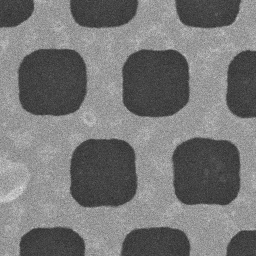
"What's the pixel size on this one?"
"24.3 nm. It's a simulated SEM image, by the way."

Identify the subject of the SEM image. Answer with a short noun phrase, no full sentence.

holes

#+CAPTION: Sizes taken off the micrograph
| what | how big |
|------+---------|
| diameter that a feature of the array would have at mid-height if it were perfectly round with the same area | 1760 nm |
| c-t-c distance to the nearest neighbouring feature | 2490 nm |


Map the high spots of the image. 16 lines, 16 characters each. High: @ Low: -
--@@-----@@----@
-@@@@---@@@@--@@
@@@@@@@@@@@@@@@@
@@---@@@---@@@@-
@----@@@----@@--
@----@@@----@@--
@----@@@----@@--
@@@@@@@@@@@@@@@@
@@@@@@@@@@@@@@@@
@@@@@---@@@----@
@@@@----@@@----@
@@@@-----@@----@
@@@@@---@@@----@
@@@@@@@@@@@@@@@@
@@---@@@---@@@@-
@----@@@----@@--